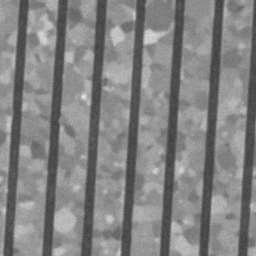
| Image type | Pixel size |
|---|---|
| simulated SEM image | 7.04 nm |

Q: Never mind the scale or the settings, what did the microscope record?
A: parallel lines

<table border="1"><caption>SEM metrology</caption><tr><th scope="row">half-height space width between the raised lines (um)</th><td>0.0729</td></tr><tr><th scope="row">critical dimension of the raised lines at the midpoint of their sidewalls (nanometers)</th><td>200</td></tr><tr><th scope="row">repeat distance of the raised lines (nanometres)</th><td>275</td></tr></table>